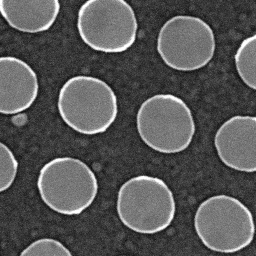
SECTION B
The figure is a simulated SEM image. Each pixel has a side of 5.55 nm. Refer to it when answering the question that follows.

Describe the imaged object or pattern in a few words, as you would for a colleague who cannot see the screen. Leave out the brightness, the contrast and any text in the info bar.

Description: raised bodies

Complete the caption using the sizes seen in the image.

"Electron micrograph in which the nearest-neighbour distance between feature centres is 448 nanometres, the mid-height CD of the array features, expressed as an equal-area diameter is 315 nanometers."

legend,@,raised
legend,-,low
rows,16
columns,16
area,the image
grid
@@@@-@@@--------
-@@--@@@--@@@---
-----@@@--@@@--@
----------@@@--@
@@-------------@
@@--@@@---------
@@--@@@--@@-----
----@@@--@@@--@@
---------@@@--@@
@-------------@@
@--@@----------@
@-@@@@--@@------
---@@@-@@@@--@@-
--------@@@-@@@@
---------@--@@@@
--@@---------@@-